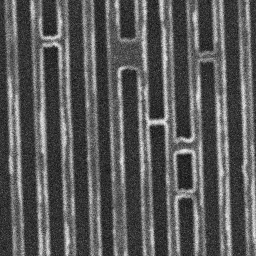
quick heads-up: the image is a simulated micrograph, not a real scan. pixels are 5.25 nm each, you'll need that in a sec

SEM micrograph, parallel lines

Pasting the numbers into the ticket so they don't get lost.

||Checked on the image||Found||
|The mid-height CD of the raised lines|0.0538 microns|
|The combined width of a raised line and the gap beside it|136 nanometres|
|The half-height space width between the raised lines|81.4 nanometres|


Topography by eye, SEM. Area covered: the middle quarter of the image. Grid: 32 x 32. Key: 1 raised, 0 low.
10000111000111111111100001100001
10000111000111100011100001100001
10000111000111000001100001100001
10000111000111000001100001100001
10000011000111000001100001100000
10000011000111000001100001100000
10000011000111000001100001100000
10000011000111000001100001100000
10000011000011000001100001100000
10000011000011000001100001100000
11000011000011000001100001100000
11000011000011000001100001100000
11000011000011000001100001100000
11000011000011000001100001110000
11000011000011000001111111110000
11000011000011100001100001110000
11000011000011100001100001110000
11000011000011100001100000110000
11000011000011100001100000110100
11000011000011100001100000111111
11000011000011100001100000111111
11000011000011100001100000111111
11000011000011100001100000111000
11000011000011100001100000110000
11000011000011100001100000110000
11000011000011100001100000110000
11000011000011100001110000110000
11000011100011100001110000110000
11000011100011100001110000110000
11000011100011100000110000110000
11000011100011100000110000110000
11000001100011100000110000110101